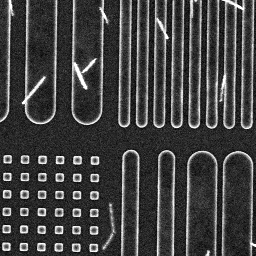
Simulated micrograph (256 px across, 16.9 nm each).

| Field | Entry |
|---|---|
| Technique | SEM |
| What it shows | groups of lines, slits or small figures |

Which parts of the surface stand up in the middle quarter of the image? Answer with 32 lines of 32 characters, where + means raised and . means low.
..++++++++....++..+++..++..+++.+
..++++++++....++..+++..++..+++.+
..++++++++....++..+++..++..+++.+
..++++++++....++..+++..++..+++.+
..++++++++....++..+++..++..+++.+
..++++++++....++..+++..++..++..+
..++++++++....++..+++..++..++..+
..+++++++.....++..+++..++..++..+
..+++++++.....++..+++..++..++..+
..+++++++.....++..+++..++..++..+
..+++++++.....++..+++..++..++..+
..+++++++.....++..+++..++..++..+
..+++++++.....++..+++..++..++..+
...++++++.....++..+++..++..++..+
....++++......++..+++..++..++..+
..............++...+...++..++...
................................
................................
................................
................................
................................
................................
...............+++......+++.....
...+...+.......++++.....+++.....
..++...++......++++.....+++....+
...............++++.....+++....+
...............++++.....+++....+
...............++++.....+++....+
..++...+.......++++.....+++....+
...............++++.....+++....+
...............++++.....+++....+
...............++++.....+++....+